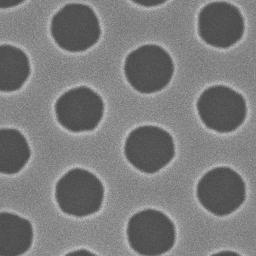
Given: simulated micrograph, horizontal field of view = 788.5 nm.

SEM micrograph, a regular array of holes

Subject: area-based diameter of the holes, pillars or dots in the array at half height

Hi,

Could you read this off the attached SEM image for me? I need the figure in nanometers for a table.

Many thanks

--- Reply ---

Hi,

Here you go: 152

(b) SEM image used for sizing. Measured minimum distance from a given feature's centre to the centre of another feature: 253 nm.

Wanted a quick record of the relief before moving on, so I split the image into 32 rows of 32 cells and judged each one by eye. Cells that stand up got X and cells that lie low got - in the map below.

---XXXXX--XXXXXXX---XXXXXX---XXX
XXXXXXX-----XXXXXXXXXXXXX-----XX
XXXXXX------XXXXXXXXXXXXX-----XX
XXXXXX-------XXXXXXXXXXXX------X
XXXXXX-------XXXXXXXXXXXX-----XX
XXXXXXX-----XXXXXXXXXXXXXX---XXX
---XXXXXX-XXXXXX-----XXXXXXXXXXX
----XXXXXXXXXXXX------XXXXXXXXXX
----XXXXXXXXXXX-------XXXXXXXXXX
----XXXXXXXXXXXX------XXXXXXXXXX
---XXXXXXXXXXXXX-----XXXXXXXXXXX
-XXXXXXX----XXXXX---XXXXX-----XX
XXXXXXX------XXXXXXXXXXXX------X
XXXXXXX------XXXXXXXXXXXX------X
XXXXXXX------XXXXXXXXXXXX------X
XXXXXXX-----XXXXXXXXXXXXXX----XX
---XXXXXX-XXXXXX-----XXXXXX--XXX
---XXXXXXXXXXXXX------XXXXXXXXXX
----XXXXXXXXXXXX------XXXXXXXXXX
----XXXXXXXXXXXX------XXXXXXXXXX
---XXXXXXXXXXXXX-----XXXXXXXXXXX
--XXXXXX---XXXXXXX--XXXXXX----XX
XXXXXXX-----XXXXXXXXXXXXX-----XX
XXXXXXX------XXXXXXXXXXXX------X
XXXXXXX------XXXXXXXXXXXX------X
XXXXXXX------XXXXXXXXXXXX-----XX
-XXXXXXX----XXXXX---XXXXXX---XXX
---XXXXXXXXXXXXX-----XXXXXXXXXXX
----XXXXXXXXXXXX------XXXXXXXXXX
----XXXXXXXXXXXX------XXXXXXXXXX
----XXXXXXXXXXXX------XXXXXXXXXX
---XXXXXX--XXXXXX----XXXXXX--XXX